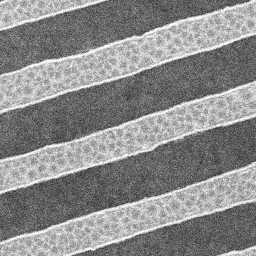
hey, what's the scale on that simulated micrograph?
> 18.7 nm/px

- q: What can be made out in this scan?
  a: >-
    one or a few lines or trenches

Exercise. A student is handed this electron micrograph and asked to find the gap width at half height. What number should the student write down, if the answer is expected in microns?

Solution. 0.883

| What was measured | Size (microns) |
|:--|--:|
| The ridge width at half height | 0.578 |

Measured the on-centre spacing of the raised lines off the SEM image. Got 1480 nm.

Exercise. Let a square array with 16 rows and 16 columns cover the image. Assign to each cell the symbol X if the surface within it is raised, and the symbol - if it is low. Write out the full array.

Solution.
XXXXX---------XX
X----------XXXXX
--------XXXXXXX-
-----XXXXXX-----
-XXXXXXXX-------
XXXXX----------X
XX----------XXXX
---------XXXXXX-
------XXXXX-----
--XXXXXXX-------
XXXXX----------X
XX----------XXXX
---------XXXXXXX
------XXXXXX----
---XXXXXX-------
XXXXXX----------